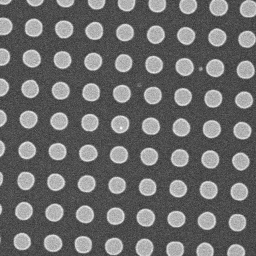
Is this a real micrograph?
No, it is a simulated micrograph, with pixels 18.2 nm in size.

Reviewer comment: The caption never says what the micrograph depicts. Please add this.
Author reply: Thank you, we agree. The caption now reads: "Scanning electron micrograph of an array of small figures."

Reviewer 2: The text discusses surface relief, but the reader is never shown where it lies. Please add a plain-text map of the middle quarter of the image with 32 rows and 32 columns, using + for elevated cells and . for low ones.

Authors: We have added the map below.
+.....+++....++++....+++....++++
..............++.....+++....++++
.............................+++
................................
................................
+....+++......+.................
+....++++...++++.....+++....+++.
+....++++...+++++...++++....++++
.....+++.....+++....++++....++++
..............+......+++....+++.
................................
................................
................................
+....+++.....+++.....+..........
+....++++...++++....++++....+++.
+....+++....++++....++++...++++.
.....++.....++++....++++...++++.
............................+++.
................................
................................
.....++.........................
....++++....+++.....+++......+..
....++++....++++...++++....++++.
....++++....++++...++++....++++.
.............++.....+++....++++.
............................++..
................................
................................
....+++.....++..................
....++++...++++....++++....+++..
....++++...++++....++++....+++..
....+++.....+++....++++....++++.